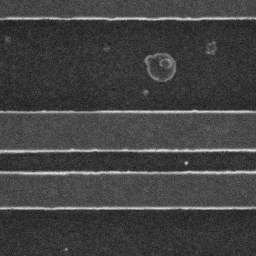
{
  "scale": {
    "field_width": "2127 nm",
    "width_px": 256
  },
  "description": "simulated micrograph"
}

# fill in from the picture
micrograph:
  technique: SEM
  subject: lines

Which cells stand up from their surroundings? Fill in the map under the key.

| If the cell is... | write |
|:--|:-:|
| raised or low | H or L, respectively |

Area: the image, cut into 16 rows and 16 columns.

HHHHHHHHHHHHHHHH
LLLLLLLLLLLLLLLL
LLLLLLLLLLLLLLLL
LLLLLLLLLLLLLLLL
LLLLLLLLLLLLLLLL
LLLLLLLLLLLLLLLL
LLLLLLLLLLLLLLLL
HHHHHHHHHHHHHHHH
HHHHHHHHHHHHHHHH
HHHHHHHHHHHHHHHH
HHHHHHHHHHHHHHHH
HHHHHHHHHHHHHHHH
HHHHHHHHHHHHHHHH
LLLLLLLLLLLLLLLL
LLLLLLLLLLLLLLLL
LLLLLLLLLLLLLLLL